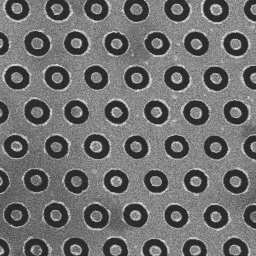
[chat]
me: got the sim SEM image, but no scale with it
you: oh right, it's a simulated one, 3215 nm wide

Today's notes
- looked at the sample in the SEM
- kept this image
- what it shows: a regular array of ring-shaped grooves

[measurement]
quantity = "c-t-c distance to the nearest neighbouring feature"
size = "495 nm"